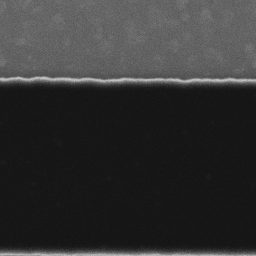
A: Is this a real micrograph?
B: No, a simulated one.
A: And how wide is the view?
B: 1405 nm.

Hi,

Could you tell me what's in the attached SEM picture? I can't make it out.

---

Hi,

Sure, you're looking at one or a few lines or trenches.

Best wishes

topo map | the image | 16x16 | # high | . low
................
................
................
................
................
################
################
################
################
################
################
################
################
################
################
################